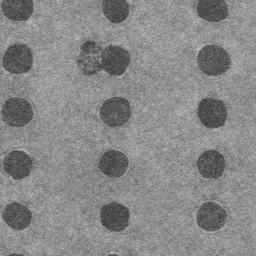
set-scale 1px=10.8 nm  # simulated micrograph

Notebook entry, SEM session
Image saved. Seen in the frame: a regular array of raised bodies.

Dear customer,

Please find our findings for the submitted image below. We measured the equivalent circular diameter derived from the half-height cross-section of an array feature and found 340 nanometres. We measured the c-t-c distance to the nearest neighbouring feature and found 563 nanometres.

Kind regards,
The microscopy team